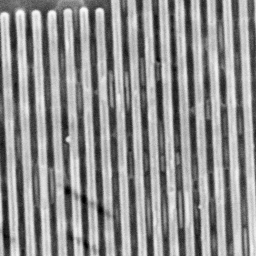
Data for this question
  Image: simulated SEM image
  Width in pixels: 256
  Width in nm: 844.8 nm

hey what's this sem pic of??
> parallel lines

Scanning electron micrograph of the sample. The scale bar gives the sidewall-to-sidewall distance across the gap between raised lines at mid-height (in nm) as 25.1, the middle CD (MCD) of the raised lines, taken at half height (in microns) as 0.0251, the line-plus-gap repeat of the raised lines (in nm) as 52.6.